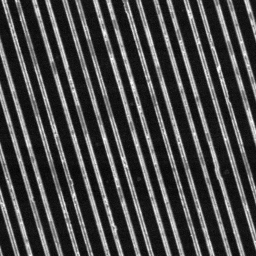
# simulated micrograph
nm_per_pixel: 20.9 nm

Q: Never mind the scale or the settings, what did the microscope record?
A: parallel lines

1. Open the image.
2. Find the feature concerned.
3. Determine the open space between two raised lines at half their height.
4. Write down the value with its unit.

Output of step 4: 201 nm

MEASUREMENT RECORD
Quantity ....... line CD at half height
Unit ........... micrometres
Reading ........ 0.0805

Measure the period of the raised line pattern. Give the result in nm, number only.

304